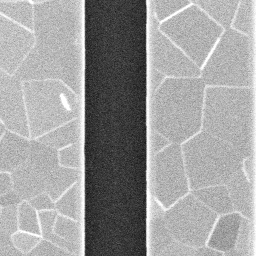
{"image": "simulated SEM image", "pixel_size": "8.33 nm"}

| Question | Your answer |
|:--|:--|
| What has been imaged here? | wiring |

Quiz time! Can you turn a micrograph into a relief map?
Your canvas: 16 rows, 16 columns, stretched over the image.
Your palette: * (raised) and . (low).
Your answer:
*****....*******
*****....*******
*****....*******
*****....*******
*****....*******
*****....*******
*****....*******
*****....*******
*****....*******
*****....*******
*****....*******
*****....*******
*****....*******
*****....*******
*****....*******
*****....*******